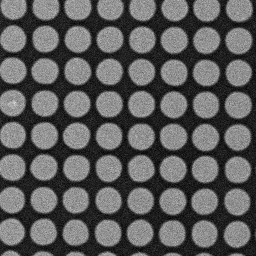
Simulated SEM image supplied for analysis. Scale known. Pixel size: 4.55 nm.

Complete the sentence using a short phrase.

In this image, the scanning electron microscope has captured an array of small figures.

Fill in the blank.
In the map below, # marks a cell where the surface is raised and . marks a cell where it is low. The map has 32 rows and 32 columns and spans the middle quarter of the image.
######...#####...#####...#####..
#######.#######.#######.#######.
#######.#######.#######.#######.
.#####...#####...#####...######.
..###....####.....###....#####..
................................
................................
.####....####....####.....###...
######..######...#####...#####..
######..######..######..#######.
######..######..######..#######.
.#####..######..######..######..
.####....####....####....#####..
................................
................................
.####....####....####.....###...
######...#####...#####..######..
######..######..#######.#######.
######..######..#######.#######.
######..######..######..######..
.####....####....#####...#####..
................................
................................
.####....####....####.....###...
######..######...#####...#####..
######..######..######..######..
######..######..######..#######.
######..######..######..######..
.####....####....####....#####..
...........................#....
................................
.####....####....####.....###...